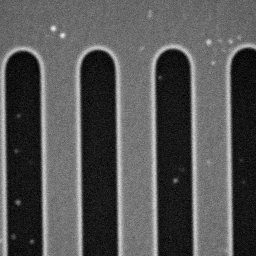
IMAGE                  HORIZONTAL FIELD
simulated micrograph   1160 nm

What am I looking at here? groups of lines, slits or small figures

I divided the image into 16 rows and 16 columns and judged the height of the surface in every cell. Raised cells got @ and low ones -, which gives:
@@@@@@@@@@@@@@@@
@@@@@@@@@@@@@@@@
@@@@@@@@@@@@@@@@
@-@@@--@@@--@@@-
---@@--@@@--@@--
---@@--@@@--@@--
---@@--@@@--@@--
---@@--@@@--@@--
---@@--@@@--@@--
---@@--@@@--@@--
---@@--@@@--@@--
---@@--@@@--@@--
---@@--@@@--@@--
---@@--@@@--@@--
---@@--@@@--@@--
---@@--@@@--@@@-